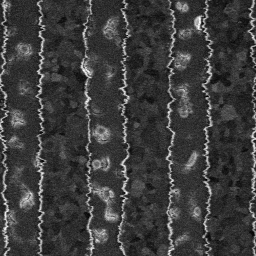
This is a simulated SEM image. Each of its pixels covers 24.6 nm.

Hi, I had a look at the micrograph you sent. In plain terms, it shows one or a few lines or trenches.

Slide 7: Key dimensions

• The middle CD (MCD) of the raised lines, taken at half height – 1150 nm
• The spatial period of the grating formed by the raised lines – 2040 nanometres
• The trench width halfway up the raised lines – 887 nanometres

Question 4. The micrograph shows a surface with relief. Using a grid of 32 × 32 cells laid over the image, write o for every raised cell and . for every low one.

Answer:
.....oooooo.....ooooo.....oooooo
o....oooooo....oooooo.....ooooo.
o....oooooo.....oooooo....ooooo.
o....oooooo.....oooooo....ooooo.
o....oooooo.....oooooo....oooooo
o....oooooo....ooooooo....oooooo
o....oooooo.....ooooo.....oooooo
o....oooooo.....ooooo.....oooooo
.....ooooo......ooooo.....oooooo
.....oooooo.....ooooo.....oooooo
.....oooooo.....ooooo.....oooooo
o....oooooo....oooooo.....oooooo
o....oooooo.....oooooo....oooooo
o....oooooo....oooooo.....oooooo
o....oooooo.....ooooo.....oooooo
.....oooooo.....ooooo.....oooooo
.....oooooo.....oooooo....oooooo
.....oooooo.....oooooo....oooooo
o....oooooo.....ooooo.....oooooo
o....oooooo.....ooooo.....oooooo
o....oooooo....oooooo.....oooooo
o....oooooo.....ooooo.....oooooo
.....oooooo.....ooooo.....oooooo
o....oooooo....oooooo.....oooooo
.....oooooo.....ooooo.....oooooo
o....oooooo....oooooo.....ooooo.
o....oooooo....oooooo.....ooooo.
o....oooooo....oooooo.....oooooo
o....oooooo....oooooo.....oooooo
o....oooooo....oooooo.....oooooo
o....ooooooo...oooooo.....oooooo
o....oooooo....oooooo.....oooooo